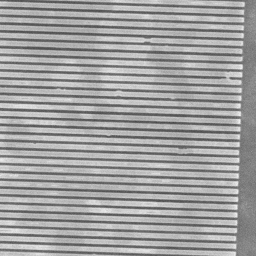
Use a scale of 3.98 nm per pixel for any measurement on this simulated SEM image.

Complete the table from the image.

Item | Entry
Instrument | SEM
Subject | parallel lines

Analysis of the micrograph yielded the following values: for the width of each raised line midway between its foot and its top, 17.9 nm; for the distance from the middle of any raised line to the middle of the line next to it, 31 nanometers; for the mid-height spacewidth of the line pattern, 3.62 pixels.